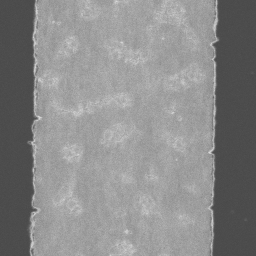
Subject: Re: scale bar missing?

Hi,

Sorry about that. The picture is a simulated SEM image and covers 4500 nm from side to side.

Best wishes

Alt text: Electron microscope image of one or a few lines or trenches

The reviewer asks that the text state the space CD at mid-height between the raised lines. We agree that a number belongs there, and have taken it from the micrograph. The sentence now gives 3.14 µm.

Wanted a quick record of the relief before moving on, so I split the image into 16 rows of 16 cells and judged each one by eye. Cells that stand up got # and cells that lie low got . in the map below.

##............##
##...........###
##...........###
##...........###
##...........###
##...........###
##...........###
##...........###
##...........###
##...........###
##...........###
##...........###
##...........###
##...........###
##...........###
##...........###